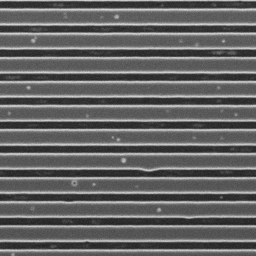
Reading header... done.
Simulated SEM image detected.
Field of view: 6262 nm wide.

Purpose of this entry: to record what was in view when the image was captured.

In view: parallel lines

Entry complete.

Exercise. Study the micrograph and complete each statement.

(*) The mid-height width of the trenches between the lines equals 214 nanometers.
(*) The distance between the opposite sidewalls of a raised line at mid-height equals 385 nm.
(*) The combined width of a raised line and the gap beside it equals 24.1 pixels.